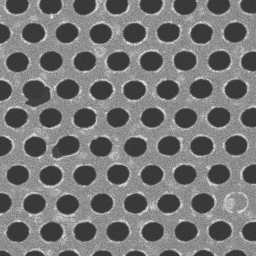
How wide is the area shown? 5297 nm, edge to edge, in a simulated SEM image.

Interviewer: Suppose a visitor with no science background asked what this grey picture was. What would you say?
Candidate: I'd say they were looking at a regular array of holes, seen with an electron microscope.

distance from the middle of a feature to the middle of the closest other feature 668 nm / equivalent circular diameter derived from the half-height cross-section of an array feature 21.7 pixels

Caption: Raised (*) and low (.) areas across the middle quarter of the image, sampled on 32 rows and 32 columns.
***.....***.....***.....****....
***....*****...*****...******...
********************************
********************************
...*****...*****...*****....****
....***.....***.....***......***
....**......***......**......**.
....***.....***.....***.....****
..*****....*****...*****....****
********************************
********************************
****...*****...*****....*****...
**......***.....***......***....
**......***.....***......***....
**......***.....***......***....
***....*****...*****....****....
********************************
********************************
...*****...*****...******...****
....***.....***.....****.....***
....**......***......**......***
....**......***......**......***
..*****....*****....****....****
********************************
********************************
****...*****....****...******...
***.....***.....****.....***....
**......***......**......**.....
**......***.....***......**.....
***....*****...*****....****....
*****.**************************
********************************